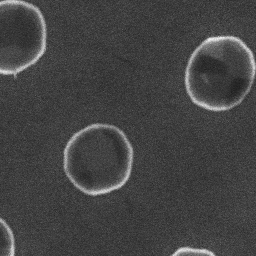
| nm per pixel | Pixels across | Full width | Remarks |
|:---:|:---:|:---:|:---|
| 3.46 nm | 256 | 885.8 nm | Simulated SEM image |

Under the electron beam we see raised bodies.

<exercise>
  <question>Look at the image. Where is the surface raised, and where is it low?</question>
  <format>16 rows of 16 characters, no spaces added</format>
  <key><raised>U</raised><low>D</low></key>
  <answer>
UUDDDDDDDDDDDDDD
UUUDDDDDDDDDDDDD
UUUDDDDDDDDDDUUD
UUDDDDDDDDDDUUUU
UDDDDDDDDDDDUUUU
DDDDDDDDDDDDUUUU
DDDDDDDDDDDDDUUD
DDDDDDDDDDDDDDDD
DDDDDUUUDDDDDDDD
DDDDUUUUDDDDDDDD
DDDDUUUUDDDDDDDD
DDDDDUUUDDDDDDDD
DDDDDDDDDDDDDDDD
DDDDDDDDDDDDDDDD
UDDDDDDDDDDDDDDD
UDDDDDDDDDDDDDDD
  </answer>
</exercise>